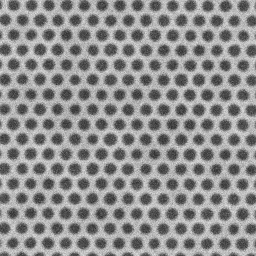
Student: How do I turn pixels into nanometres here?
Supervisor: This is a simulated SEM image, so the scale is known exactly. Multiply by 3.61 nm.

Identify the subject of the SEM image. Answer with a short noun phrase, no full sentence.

a regular array of holes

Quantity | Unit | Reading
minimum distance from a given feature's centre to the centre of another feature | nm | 61.3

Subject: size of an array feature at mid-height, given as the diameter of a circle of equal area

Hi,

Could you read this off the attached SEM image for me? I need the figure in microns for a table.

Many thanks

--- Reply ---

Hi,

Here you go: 0.0463